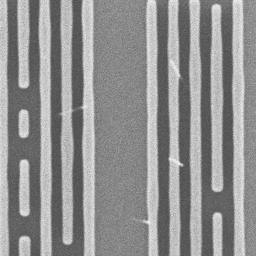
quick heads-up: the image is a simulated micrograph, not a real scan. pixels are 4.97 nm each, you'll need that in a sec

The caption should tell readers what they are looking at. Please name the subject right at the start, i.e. groups of lines, slits or small figures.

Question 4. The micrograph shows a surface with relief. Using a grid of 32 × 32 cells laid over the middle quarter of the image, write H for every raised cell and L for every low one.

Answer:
HHLLLHHLLLLLLLLLLLLLLHHLLLHHHLLL
HHLLLHHLLLLLLLLLLLLLLHHLLLHHHLLL
HHLLLHHLLLLLLLLLLLLLLHHLLLHHHLLL
HHLLLHHLLLLLLLLLLLLLLHHLLLHHHLLL
HHLLLHHLLLLLLLLLLLLLLHHLLLHHHLLL
HHLLLHHLLLLLLLLLLLLLLHHLLLHHHLLL
HHLLLHHLLLLLLLLLLLLLLHHLLLHHHLLL
HHLLLHHLLLLLLLLLLLLLLHHLLLHHLLLL
HHLLLHHLLLLLLLLLLLLLLHHLLLHHLLLL
HHLLLHHLLLLLLLLLLLLLLHHLLLHHHLLL
HHLLLHHLLLLLLLLLLLLLLHHLLLHHHLLL
HHLLLHHLLLLLLLLLLLLLLHHLLLHHHLLL
HHLLLHHLLLLLLLLLLLLLLHHLLLHHHLLL
HHLLLHHLLLLLLLLLLLLLLHHLLLHHHLLL
HHLLLHHLLLLLLLLLLLLLLHHLLLHHHLLL
HHLLLHHLLLLLLLLLLLLLLHHLLLHHHLLL
HHLLLHHLLLLLLLLLLLLLLHHLLLHHHLLL
HHLLLHHHLLLLLLLLLLLLLHHLLLLHLLLL
HHLLLHHHLLLLLLLLLLLLLHHLLLLHLLLL
HHLLLHHHLLLLLLLLLLLLLHHLLLLHHLLL
HHLLLHHHLLLLLLLLLLLLLHHLLLHHHLLL
HHLLLHHHLLLLLLLLLLLLLHHLLLHHHLLL
HHLLLHHHLLLLLLLLLLLLLHHLLLHHHLLL
HHLLLHHHLLLLLLLLLLLLLHHLLLHHHLLL
HHLLLHHHLLLLLLLLLLLLLHHLLLHHHLLL
HHLLLHHHLLLLLLLLLLLLLHHLLLHHHLLL
HHLLLHHHLLLLLLLLLLLLLHHLLLHHHLLL
HHLLLHHHLLLLLLLLLLLLLHHLLLHHHLLL
HHLLLHHHLLLLLLLLLLLLLHHLLLHHHLLL
HHLLLHHHLLLLLLLLLLLLLHHLLLHHHLLL
HHLLLHHHLLLLLLLLLLLLLHHLLLHHHLLL
HHLLLHHHLLLLLLLLLLLLLHHLLLHHHLLL